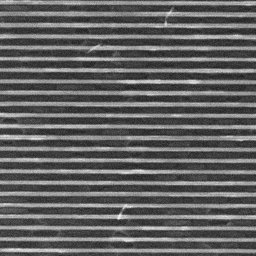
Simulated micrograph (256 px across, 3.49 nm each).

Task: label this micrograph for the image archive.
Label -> parallel lines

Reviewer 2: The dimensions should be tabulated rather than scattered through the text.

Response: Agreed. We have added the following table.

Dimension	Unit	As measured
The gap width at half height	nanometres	28.8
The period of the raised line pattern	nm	39.3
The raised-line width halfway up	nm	10.5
